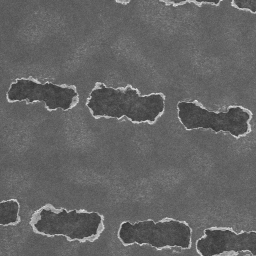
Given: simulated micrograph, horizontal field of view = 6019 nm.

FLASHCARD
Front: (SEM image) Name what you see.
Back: holes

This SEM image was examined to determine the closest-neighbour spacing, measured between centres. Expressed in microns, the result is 2.09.